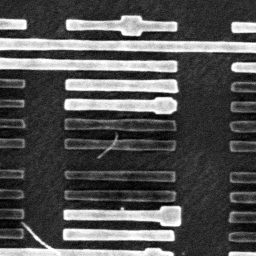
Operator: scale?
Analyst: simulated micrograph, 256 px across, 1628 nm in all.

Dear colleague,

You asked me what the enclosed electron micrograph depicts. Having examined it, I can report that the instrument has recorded wiring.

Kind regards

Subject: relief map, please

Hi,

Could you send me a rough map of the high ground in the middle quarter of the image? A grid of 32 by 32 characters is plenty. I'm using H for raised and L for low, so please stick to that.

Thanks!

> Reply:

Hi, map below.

HHHHHHHHHHHHHHHHHHHHHHHHHHHHLLLL
LLLLLLLLLLLLLLLLLLLHHHHHHHHHLLLL
LLLLLLLLLLLLLLLLLLLLLLLLLLLLLLLL
LLLLLLLLLLLLLLLLLLLLLLLLLLLLLLLL
LHHHHHHHHHHHHHHHHHHHHHHHHHHHLLLL
LHHHHHHHHHHHHHHHHHHHHHHHHHHHLLLL
LLLLLLLLLLHHHHHHHHHHHHHHHHHHLLLL
LLLLLLLLLLLLLLLLLLLLLLLLLLLLLLLL
LLLLLLLLLLLLLLLLLLLLLLLLLLLLLLLL
HHHHHHHHHHHHHHHHHHHHHHHHHHHHLLLL
HHHHHHHHHHHHHHHHHHHHHHHHHHHHLLLL
LLLLLLLLLLLLLHHHHHHHHHHHHHHHLLLL
LLLLLLLLLLLLLLLLLLLLLLLLLLLLLLLL
LLLLLLLLLLLLLLLLLLLLLLLLLLLLLLLL
HHHHHHHHHHHHHHHHHHHHHHHHHHHHLLLL
HHHHHHHHHHHHHHHHHHHHHHHHHHHHLLLL
LLLLLLLLLLLLLLHHHHHHHHHHHHHHLLLL
LLLLLLLLLLLLLLLLLLLLLLLLLLLLLLLL
LLLLLLLLLLLLLLLLLLLLLLLLLLLLLLLL
HHHHHHHHHHHHHHHHHHHHHHHHHHHHLLLL
HHHHHHHHHHHHHHHHHHHHHHHHHHHHLLLL
LLLLLLLLLLHLLLLLLHHHHHHHHHHLLLLL
LLLLLLLLLLLLLLLLLLLLLLLLLLLLLLLL
LLLLLLLLLLLLLLLLLLLLLLLLLLLLLLLL
LLLLLLLLLLLLLLLLLLLLLLLLLLLLLLLL
LLLLLLLLLLLLLLLLLLLLLLLLLLLLLLLL
LLLLLLLLLLLLLLLLLLLLLLLLLLLLLLLL
HHHHHHHHHHHHHHHHHHHHHHHHHHHHLLLL
LHHHHHHHHHHHHHHHHHHHHHHHHHHHLLLL
LLLLLLLLLLLLLLLLLLLLLLLLLLLLLLLL
LLLLLLLLLLLLLLLLLLLLLLLLLLLLLLLL
LLLLLLLLLLLLLLLLLLLLLLLLLLLLLLLL